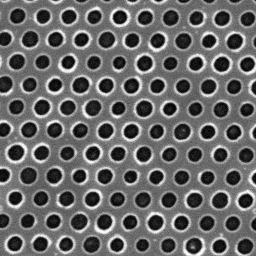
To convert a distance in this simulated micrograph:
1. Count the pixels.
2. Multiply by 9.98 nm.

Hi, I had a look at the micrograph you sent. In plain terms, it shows a regular array of holes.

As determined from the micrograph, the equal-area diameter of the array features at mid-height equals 154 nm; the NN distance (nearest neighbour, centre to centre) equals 254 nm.